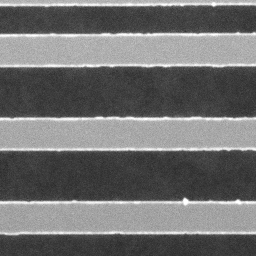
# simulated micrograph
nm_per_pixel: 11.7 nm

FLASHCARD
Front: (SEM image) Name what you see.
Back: lines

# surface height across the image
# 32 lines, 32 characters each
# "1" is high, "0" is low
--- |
11111111111111111111111111111111
00000000000000000000000000000000
00000000000000000000000000000000
00000000000000000000000000000000
11111111111111111111111111111111
11111111111111111111111111111111
11111111111111111111111111111111
11111111111111111111111111111111
00000000000000000000000000000000
00000000000000000000000000000000
00000000000000000000000000000000
00000000000000000000000000000000
00000000000000000000000000000000
00000000000000000000000000000000
00000000000000000000000000000000
11111111111111111111111111111111
11111111111111111111111111111111
11111111111111111111111111111111
11111111111111111111111111111111
00000000000000000000000000000000
00000000000000000000000000000000
00000000000000000000000000000000
00000000000000000000000000000000
00000000000000000000000000000000
00000000000000000000000000000000
11111111111111111111111111111111
11111111111111111111111111111111
11111111111111111111111111111111
11111111111111111111111111111111
00000000000000000000000000000000
00000000000000000000000000000000
00000000000000000000000000000000